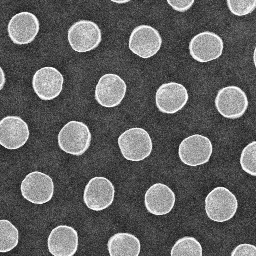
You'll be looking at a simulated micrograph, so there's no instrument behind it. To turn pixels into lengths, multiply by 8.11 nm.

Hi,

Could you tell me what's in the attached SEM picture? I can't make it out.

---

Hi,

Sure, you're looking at a regular array of raised bodies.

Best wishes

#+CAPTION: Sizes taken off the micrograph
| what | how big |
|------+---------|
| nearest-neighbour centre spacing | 484 nm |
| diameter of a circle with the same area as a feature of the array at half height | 255 nm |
